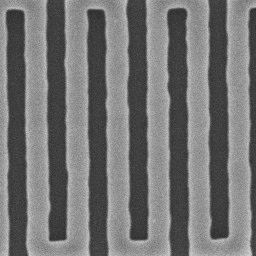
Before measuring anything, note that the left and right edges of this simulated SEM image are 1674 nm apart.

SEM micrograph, groups of lines, slits or small figures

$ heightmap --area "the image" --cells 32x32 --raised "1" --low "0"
11111100111111110011111111001111
10011100111001110011100111001110
10011100111001110011100111001110
10011100111001110011100111001110
10011100111001110011100111001110
10011100111001110011100111001110
10011100111001110011100011001110
10011100111001110011100111001110
10011100111001110001100011001110
10011100111001110001100011001110
10011100111001110001100011001110
10011100111001110011100111000110
10011100111001110011100111000110
10011100111001110011100011000110
10011100111001110011100011000110
10011100111001110001100011000110
10011100111001110001100011000110
10011100111001110001100011000110
10011100111001110001100011000110
10011100111001110001100011000110
10011100111001110001100011000110
10011100111001110001100011000110
10011100011001110001100011000110
10011100111000110001100011000110
10011100111000110001100011000110
10001100111000110001100011000110
10001100111000110001100011000110
10001100111001110001100011000110
10011100111001110001100011000110
10011100111001110001100011000110
10011111111000111111100011111110
10001111111000111111100011111110